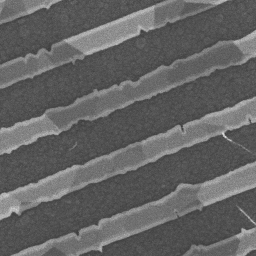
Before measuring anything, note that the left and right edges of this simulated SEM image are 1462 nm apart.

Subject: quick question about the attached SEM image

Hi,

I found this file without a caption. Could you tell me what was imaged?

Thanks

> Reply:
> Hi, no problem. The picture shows one or a few lines or trenches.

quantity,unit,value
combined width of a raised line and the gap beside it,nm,348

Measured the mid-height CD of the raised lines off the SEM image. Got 111 nm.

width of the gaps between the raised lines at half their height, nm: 233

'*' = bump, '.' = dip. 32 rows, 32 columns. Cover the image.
******..............*******.....
****..............*******.......
*..............*******..........
............*******.............
..........******...............*
.......*******.............*****
.....******..............*******
..*******..............********.
******..............*******.....
****..............*******.......
*..............********.........
.............*******............
..........*******..............*
........*******..............***
.....*******..............******
..*******...............******..
********.............*******....
****..............*******.......
**..............*******.........
..............******............
...........*******..............
........*******..............***
.....*******...............*****
...******.............*********.
*******..............*******....
****...............*******......
*...............*******.........
.............********...........
...........*******..............
.........*******..............**
......*******..............*****
...*******..............*******.